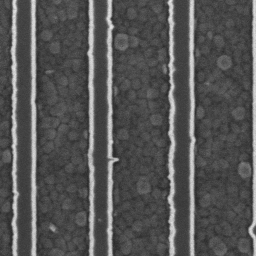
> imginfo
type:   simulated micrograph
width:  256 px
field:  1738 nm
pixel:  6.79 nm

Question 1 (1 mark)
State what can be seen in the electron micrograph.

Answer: one or a few lines or trenches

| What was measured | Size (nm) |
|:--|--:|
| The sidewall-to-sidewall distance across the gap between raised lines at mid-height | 415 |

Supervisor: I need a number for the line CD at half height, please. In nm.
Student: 132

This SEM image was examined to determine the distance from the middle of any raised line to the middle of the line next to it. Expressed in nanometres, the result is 535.